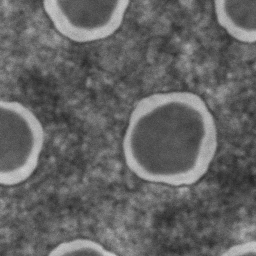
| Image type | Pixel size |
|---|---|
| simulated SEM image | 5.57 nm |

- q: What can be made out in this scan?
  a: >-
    raised bodies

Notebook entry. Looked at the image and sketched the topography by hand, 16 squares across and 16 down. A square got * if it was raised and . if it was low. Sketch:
...*****......**
....***.......**
................
................
................
................
.........***....
**......*****...
**......*****...
**......*****...
**.......***....
................
................
................
................
....**.........*